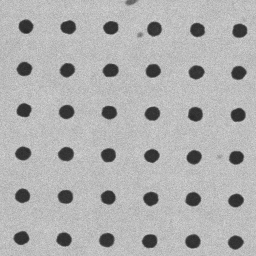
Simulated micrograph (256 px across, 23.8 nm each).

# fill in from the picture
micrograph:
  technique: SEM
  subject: a regular array of holes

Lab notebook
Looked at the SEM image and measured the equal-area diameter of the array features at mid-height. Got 353 nm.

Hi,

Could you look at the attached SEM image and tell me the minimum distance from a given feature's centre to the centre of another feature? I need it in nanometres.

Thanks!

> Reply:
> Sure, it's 1000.